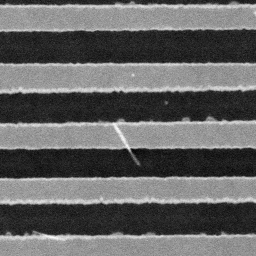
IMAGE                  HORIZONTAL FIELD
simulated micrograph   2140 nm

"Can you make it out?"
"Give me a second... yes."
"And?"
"lines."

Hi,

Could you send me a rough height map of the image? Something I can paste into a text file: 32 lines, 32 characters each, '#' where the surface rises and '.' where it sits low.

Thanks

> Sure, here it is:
................................
################################
################################
################################
................................
................................
................................
................................
################################
################################
################################
#########.#.....................
................................
................................
................................
################################
################################
################################
################################
................................
................................
................................
################################
################################
################################
.#..............................
................................
................................
................................
################################
################################
################################